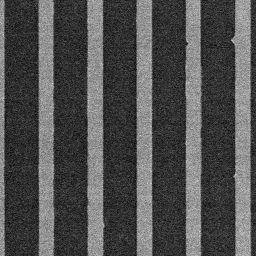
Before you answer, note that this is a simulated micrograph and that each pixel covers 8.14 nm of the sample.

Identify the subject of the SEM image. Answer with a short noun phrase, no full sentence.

parallel lines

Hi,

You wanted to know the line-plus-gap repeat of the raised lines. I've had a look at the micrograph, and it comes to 49.1 px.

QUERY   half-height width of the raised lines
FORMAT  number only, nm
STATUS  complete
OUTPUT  121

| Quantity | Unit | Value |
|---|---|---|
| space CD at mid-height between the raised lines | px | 34.9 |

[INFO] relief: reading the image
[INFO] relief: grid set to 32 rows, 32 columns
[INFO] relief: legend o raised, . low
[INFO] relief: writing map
.....oo....oo....oo....oo....oo.
.....oo....oo....oo....oo....oo.
.....oo....oo....oo....oo....oo.
.....oo....oo....oo....oo....oo.
.....oo....oo....oo....oo....oo.
.....oo....oo....oo....oo....oo.
.....oo....oo....oo....oo....oo.
.....oo....oo....oo....oo....oo.
.....oo....oo....oo....oo....oo.
.....oo....oo....oo....oo....oo.
.....oo....oo....oo....oo....oo.
.....oo....oo....oo....oo....oo.
.....oo....oo....oo....oo....oo.
.....oo....oo....oo....oo....oo.
.....oo....oo....oo....oo....oo.
.....oo....oo....oo....oo....oo.
.....oo....oo....oo....oo....oo.
.....oo....oo....oo....oo....oo.
.....oo....oo....oo....oo....oo.
.....oo....oo....oo....oo....oo.
.....oo....oo....oo....oo....oo.
.....oo....oo....oo....oo....oo.
.....oo....oo....oo....oo....oo.
.....oo....oo....oo....oo....oo.
.....oo....oo....oo....oo....oo.
.....oo....oo....oo....oo....oo.
.....oo....oo....oo....oo....oo.
.....oo....oo....oo....oo.....o.
.....oo....oo....oo....oo.....o.
.....oo....oo....oo....oo.....o.
.....oo....oo....oo....oo.....o.
.....oo....oo....oo....oo.....o.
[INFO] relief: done